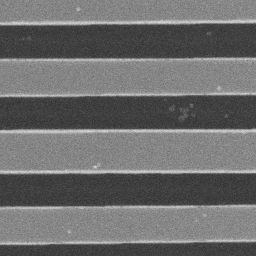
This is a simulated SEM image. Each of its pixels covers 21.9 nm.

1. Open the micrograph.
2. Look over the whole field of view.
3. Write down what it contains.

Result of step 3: lines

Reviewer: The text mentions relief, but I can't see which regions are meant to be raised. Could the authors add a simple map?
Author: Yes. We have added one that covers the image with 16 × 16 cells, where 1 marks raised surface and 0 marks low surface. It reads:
1111111111111111
1111110000000000
0000000000000000
0000000000000000
1111111111111111
1111111111111111
0000000000000000
0000000000000000
1111111111111111
1111111111111111
1111111111111111
0000000000000000
0000000000000000
1111111111111111
1111111111111111
0000000000000000